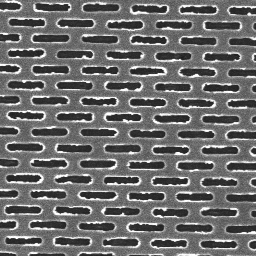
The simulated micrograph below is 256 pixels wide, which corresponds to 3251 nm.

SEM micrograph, a regular array of holes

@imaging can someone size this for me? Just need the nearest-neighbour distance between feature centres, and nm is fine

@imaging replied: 358